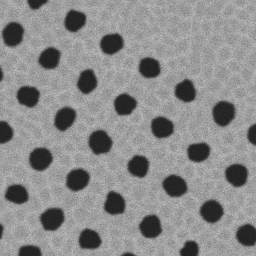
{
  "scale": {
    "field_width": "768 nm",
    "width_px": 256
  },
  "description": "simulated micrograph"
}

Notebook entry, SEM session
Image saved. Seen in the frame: a regular array of holes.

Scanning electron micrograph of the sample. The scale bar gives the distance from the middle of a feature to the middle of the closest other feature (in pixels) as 43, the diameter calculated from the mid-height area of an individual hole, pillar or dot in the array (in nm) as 64.5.